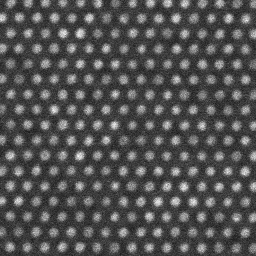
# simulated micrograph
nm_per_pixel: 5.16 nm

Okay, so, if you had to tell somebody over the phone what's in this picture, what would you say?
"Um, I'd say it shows a regular array of raised bodies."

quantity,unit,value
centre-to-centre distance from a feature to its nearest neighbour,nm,88.1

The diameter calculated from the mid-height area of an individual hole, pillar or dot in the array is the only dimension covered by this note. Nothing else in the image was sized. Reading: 46.9 nanometers